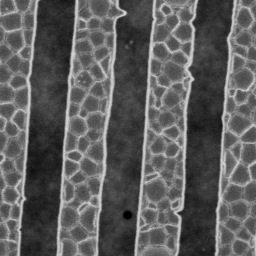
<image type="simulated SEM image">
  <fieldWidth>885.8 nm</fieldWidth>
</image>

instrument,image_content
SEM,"one or a few lines or trenches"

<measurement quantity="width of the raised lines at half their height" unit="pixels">41.3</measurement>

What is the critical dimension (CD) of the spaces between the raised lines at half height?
131 nm